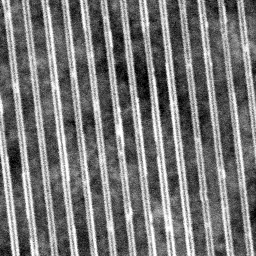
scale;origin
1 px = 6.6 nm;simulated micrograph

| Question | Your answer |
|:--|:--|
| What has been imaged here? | parallel lines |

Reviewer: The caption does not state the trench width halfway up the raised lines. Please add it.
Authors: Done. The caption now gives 99.1 nanometers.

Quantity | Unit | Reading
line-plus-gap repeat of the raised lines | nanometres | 128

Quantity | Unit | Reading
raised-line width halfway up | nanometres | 32.7